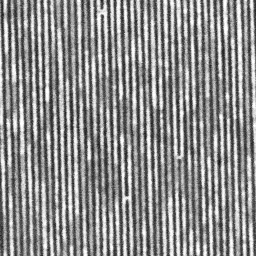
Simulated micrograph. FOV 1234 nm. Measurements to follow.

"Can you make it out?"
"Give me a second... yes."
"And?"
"parallel lines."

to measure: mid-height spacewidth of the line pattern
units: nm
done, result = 19.9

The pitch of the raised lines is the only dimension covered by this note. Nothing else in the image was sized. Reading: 0.0321 microns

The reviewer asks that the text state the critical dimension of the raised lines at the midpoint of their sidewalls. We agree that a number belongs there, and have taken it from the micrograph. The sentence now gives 2.37 pixels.